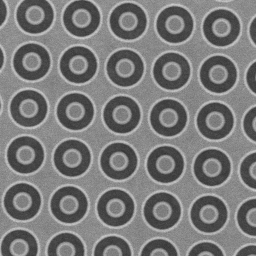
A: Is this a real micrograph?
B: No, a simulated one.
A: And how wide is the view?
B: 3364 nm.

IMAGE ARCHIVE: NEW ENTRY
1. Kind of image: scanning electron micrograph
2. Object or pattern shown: an array of small figures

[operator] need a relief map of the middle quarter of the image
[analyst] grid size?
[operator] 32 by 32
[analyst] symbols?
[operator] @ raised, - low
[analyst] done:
--@@@@---@---@@@@---@@---@@@----
--@@@---@@---@@@@---@@---@@@@---
--------@@----@@@---@@---@@@@---
-------@@@@---------@@----@@---@
@-----@@@@@@-------@@@@--------@
@@@@@@@@@@@@@----@@@@@@@------@@
@@@@@@@@@@@@@@@@@@@@@@@@@---@@@@
@----@@@@@@@@@@@@@@@@@@@@@@@@@@@
------@@@@@@-----@@@@@@@@@-@@@@@
-------@@@@-------@@@@@------@@@
-@@@----@@---------@@@--------@@
-@@@@---@@---@@@---@@@----@----@
-@@@@---@---@@@@@--@@---@@@@---@
--@@---@@@---@@@---@@---@@@@---@
-------@@@----@----@@---@@@@---@
------@@@@---------@@@---------@
@---@@@@@@@-------@@@@--------@@
@@@@@@@@@@@@@@--@@@@@@@------@@@
@@@@@@@@@@@@@@@@@@@@@@@@@@@@@@@@
-----@@@@@@@@--@@@@@@@@@@@@@@@@@
------@@@@@------@@@@@@@---@@@@@
-------@@@--------@@@@-------@@@
@@@@---@@----@----@@@---------@@
@@@@---@@---@@@@---@@---@@----@@
@@@@---@@---@@@@---@@---@@@---@@
-@-----@@---@@@---@@---@@@@---@@
------@@@---------@@@---@@@---@@
-----@@@@@-------@@@@---------@@
@@@@@@@@@@@-----@@@@@@-------@@@
@@@@@@@@@@@@@@@@@@@@@@@-----@@@@
---@@@@@@@@@@@@@@@@@@@@@@@@@@@@@
----@@@@@@@----@@@@@@@@@@@@@@@@@